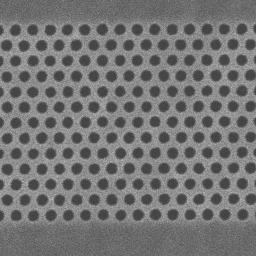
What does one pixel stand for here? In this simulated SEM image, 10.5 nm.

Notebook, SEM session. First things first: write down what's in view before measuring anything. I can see a regular array of holes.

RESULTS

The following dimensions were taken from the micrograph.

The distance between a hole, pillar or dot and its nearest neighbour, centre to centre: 181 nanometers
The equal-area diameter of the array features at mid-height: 11.6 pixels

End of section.